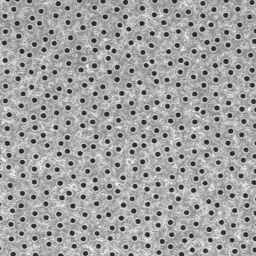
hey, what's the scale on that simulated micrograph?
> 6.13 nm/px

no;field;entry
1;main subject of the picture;a regular array of holes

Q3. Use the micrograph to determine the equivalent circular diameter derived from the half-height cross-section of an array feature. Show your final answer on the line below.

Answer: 33.9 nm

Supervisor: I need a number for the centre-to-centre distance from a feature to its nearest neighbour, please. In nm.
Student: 67.4